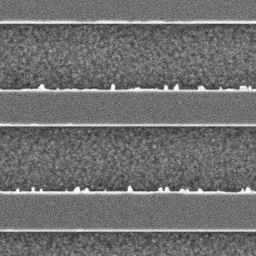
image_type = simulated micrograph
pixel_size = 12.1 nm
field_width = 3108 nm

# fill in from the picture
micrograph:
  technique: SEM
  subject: lines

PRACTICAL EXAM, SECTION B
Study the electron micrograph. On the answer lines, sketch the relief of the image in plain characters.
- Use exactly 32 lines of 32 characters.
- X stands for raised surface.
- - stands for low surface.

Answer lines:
XXXXXXXXXXXXXXXXXXXXXXXXXXXXXXXX
XXXXXXXXXXXXXXXXXXXXXXXXXXXXXXXX
XXXXXXXXXXXXXXXXXXXXXXXXXXXXXXXX
--------------------------------
--------------------------------
--------------------------------
--------------------------------
--------------------------------
--------------------------------
--------------------------------
--------------------------------
XXXXXXXXXXXXXXXXXXXXXXXXXXXXXXXX
XXXXXXXXXXXXXXXXXXXXXXXXXXXXXXXX
XXXXXXXXXXXXXXXXXXXXXXXXXXXXXXXX
XXXXXXXXXXXXXXXXXXXXXXXXXXXXXXXX
XXXXXXXXXXXXXXXXXXXXXXXXXXXXXXXX
--------------------------------
--------------------------------
--------------------------------
--------------------------------
--------------------------------
--------------------------------
--------------------------------
--------------------------------
XXXXXXXXXXXXXXXXXXXXXXXXXXXXXXXX
XXXXXXXXXXXXXXXXXXXXXXXXXXXXXXXX
XXXXXXXXXXXXXXXXXXXXXXXXXXXXXXXX
XXXXXXXXXXXXXXXXXXXXXXXXXXXXXXXX
XXXXXXXXXXXXXXXXXXXXXXXXXXXXXXXX
--------------------------------
--------------------------------
--------------------------------